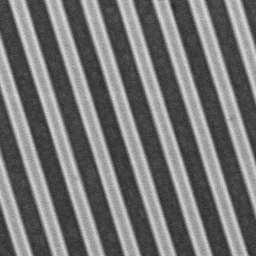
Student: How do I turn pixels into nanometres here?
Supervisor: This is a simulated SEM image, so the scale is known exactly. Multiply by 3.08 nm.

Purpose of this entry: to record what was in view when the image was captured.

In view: parallel lines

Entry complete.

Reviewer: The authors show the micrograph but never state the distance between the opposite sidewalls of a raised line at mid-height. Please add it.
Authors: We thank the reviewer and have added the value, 45.6 nm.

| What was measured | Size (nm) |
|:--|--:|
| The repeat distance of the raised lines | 106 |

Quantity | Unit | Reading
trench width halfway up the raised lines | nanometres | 61.3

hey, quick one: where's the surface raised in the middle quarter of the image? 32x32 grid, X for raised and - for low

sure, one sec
XXXX-----XXXX-----XXXX-----XXXX-
-XXXX-----XXX------XXX------XXX-
-XXXX-----XXXX-----XXXX-----XXXX
-XXXX-----XXXX-----XXXX-----XXXX
--XXXX-----XXX------XXX------XXX
--XXXX-----XXXX-----XXXX-----XXX
--XXXX-----XXXX-----XXXX-----XXX
---XXX-----XXXX------XXX-----XXX
---XXXX-----XXXX-----XXXX-----XX
---XXXX-----XXXX-----XXXX-----XX
----XXX-----XXXX------XXX-----XX
----XXXX-----XXXX-----XXX------X
----XXXX-----XXXX-----XXXX-----X
----XXXX-----XXXX-----XXXX------
-----XXXX-----XXXX-----XXX------
-----XXXX-----XXXX-----XXXX-----
-----XXXX-----XXXX-----XXXX-----
------XXXX-----XXX------XXXX----
X-----XXXX-----XXXX-----XXXX----
X------XXX-----XXXX-----XXXX----
X------XXX------XXX------XXXX---
XX-----XXXX-----XXXX-----XXXX---
XX-----XXXX-----XXXX-----XXXX---
XX------XXX-----XXXX------XXX---
XXX-----XXXX-----XXXX-----XXXX--
XXX-----XXXX-----XXXX-----XXXX--
XXX------XXX-----XXXX------XXX--
XXXX-----XXXX-----XXXX-----XXXX-
XXXX-----XXXX-----XXXX-----XXXX-
-XXX------XXX-----XXXX-----XXXX-
-XXX------XXXX-----XXX------XXXX
-XXXX-----XXXX-----XXXX-----XXXX